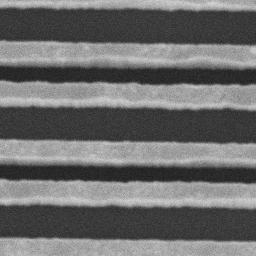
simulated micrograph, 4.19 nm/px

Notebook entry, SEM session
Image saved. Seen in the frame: lines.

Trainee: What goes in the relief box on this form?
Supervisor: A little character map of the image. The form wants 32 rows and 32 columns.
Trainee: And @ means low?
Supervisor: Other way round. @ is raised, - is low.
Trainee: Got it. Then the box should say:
@@@@@@@@@@@@@@@@-@@@@@@@@@@@@@@@
--------------------------------
--------------------------------
--------------------------------
--------------------------------
@@@@@@@@@@@@-@------------------
@@@@@@@@@@@@@@@@@@@@@@@@@@@@@@@@
@@@@@@@@@@@@@@@@@@@@@@@@@@@@@@@@
--------------------------------
--------------------------------
@@@@@@@-@@@@@@--@---------------
@@@@@@@@@@@@@@@@@@@@@@@@@@@@@@@@
@@@@@@@@@@@@@@@@@@@@@@@@@@@@@@@@
------------------------------@@
--------------------------------
--------------------------------
--------------------------------
--------------------------------
@@@@@@@@@@@@@@@@@@@@@@@@@@@@@@@@
@@@@@@@@@@@@@@@@@@@@@@@@@@@@@@@@
--------------@@-@@@@@@@----@@@@
--------------------------------
--------------------------------
@@@@@@@@@@@@@@@@@@@@@@@@@@@@@@@@
@@@@@@@@@@@@@@@@@@@@@@@@@@@@@@@@
-----------@----@-@-@@@-@@@-@@@@
--------------------------------
--------------------------------
--------------------------------
--------------------------------
@@@@@@@@@@@@@@@@@@@@@@@@@@@@@@@@
@@@@@@@@@@@@@@@@@@@@@@@@@@@@@@@@